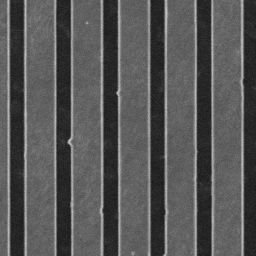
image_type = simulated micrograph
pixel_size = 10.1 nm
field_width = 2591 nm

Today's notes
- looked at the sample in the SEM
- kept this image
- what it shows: parallel lines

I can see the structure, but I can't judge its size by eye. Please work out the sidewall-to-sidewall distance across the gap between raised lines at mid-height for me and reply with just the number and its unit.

0.171 microns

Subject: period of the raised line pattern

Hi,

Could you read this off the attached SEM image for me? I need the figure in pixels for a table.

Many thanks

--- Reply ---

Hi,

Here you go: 46.7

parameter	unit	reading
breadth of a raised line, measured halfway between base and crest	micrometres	0.306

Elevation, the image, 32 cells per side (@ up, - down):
@--@@@@--@@@@--@@@@--@@@---@@@--
@--@@@@--@@@@--@@@@--@@@---@@@--
@--@@@@--@@@@--@@@@--@@@---@@@--
@--@@@@--@@@@--@@@@--@@@---@@@--
@--@@@@--@@@@--@@@@--@@@---@@@--
@--@@@@--@@@@--@@@@--@@@---@@@--
@--@@@@--@@@@--@@@@--@@@---@@@--
@--@@@@--@@@@--@@@@--@@@---@@@--
@--@@@@--@@@@--@@@@--@@@---@@@--
@--@@@@--@@@@--@@@@--@@@---@@@--
@--@@@@--@@@@--@@@@--@@@---@@@--
@--@@@@--@@@@--@@@@--@@@---@@@--
@--@@@@--@@@@--@@@@--@@@---@@@--
@--@@@@--@@@@--@@@@--@@@---@@@--
@--@@@@--@@@@--@@@@--@@@---@@@--
@--@@@@--@@@@--@@@@--@@@---@@@--
@--@@@@--@@@@--@@@@--@@@---@@@--
@--@@@@--@@@@--@@@@--@@@---@@@--
@--@@@@--@@@@--@@@@--@@@---@@@--
@--@@@@--@@@@--@@@@--@@@---@@@--
@--@@@@--@@@@--@@@@--@@@---@@@--
@--@@@@--@@@@--@@@@--@@@---@@@--
@--@@@@--@@@@--@@@@--@@@---@@@--
@--@@@@--@@@@--@@@@--@@@---@@@--
@--@@@@--@@@@--@@@@--@@@---@@@--
@--@@@@--@@@@--@@@@--@@@---@@@--
@--@@@@--@@@@--@@@@--@@@---@@@--
@--@@@@--@@@@--@@@@--@@@---@@@--
@--@@@@--@@@@--@@@@--@@@---@@@--
@--@@@@--@@@@--@@@@--@@@---@@@--
@--@@@@--@@@@--@@@@--@@@---@@@--
@--@@@@--@@@@--@@@@--@@@---@@@--